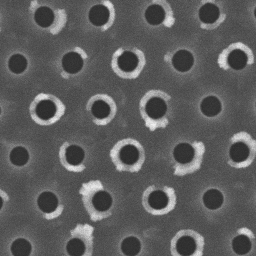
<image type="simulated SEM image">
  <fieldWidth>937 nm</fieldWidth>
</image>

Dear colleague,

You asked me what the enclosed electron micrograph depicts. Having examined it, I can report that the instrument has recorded a regular array of holes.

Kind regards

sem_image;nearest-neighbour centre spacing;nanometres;196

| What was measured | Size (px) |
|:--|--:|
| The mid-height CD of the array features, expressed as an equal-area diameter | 20.8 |